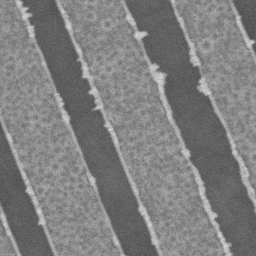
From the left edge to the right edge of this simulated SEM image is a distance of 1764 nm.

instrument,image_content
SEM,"one or a few lines or trenches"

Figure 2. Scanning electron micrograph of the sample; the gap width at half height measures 239 nm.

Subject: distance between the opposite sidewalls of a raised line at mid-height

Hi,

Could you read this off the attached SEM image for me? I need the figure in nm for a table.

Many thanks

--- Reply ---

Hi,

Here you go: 436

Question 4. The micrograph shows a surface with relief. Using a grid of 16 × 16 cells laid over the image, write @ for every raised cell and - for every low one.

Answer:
@@--@@@@---@@@@-
@@--@@@@---@@@@-
@@---@@@@---@@@@
@@@--@@@@---@@@@
@@@--@@@@@--@@@@
@@@---@@@@---@@@
@@@@--@@@@@--@@@
@@@@---@@@@---@@
@@@@@--@@@@---@@
-@@@@--@@@@@---@
-@@@@---@@@@---@
--@@@@--@@@@@--@
--@@@@---@@@@---
--@@@@@--@@@@---
@--@@@@--@@@@@--
@--@@@@@--@@@@--